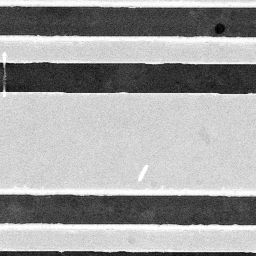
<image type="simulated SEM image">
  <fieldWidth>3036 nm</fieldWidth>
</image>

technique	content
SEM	lines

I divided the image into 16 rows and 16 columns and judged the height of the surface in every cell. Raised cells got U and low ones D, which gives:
DDDDDDDDDDDDDDDD
DDDDDDDDDDDDDDDD
UUUUUUUUUUUUUUUU
UUUUUUUUUUUUUUUU
DDDDDDDDDDDDDDDD
DDDDDDDDDDDDDDDD
UUUUUUUUUUUUUUUU
UUUUUUUUUUUUUUUU
UUUUUUUUUUUUUUUU
UUUUUUUUUUUUUUUU
UUUUUUUUUUUUUUUU
UUUUUUUUUUUUUUUU
DDDDDDDDDDDDDDDD
DDDDDDDDDDDDDDDD
UUUUUUUUUUUUUUUU
UUUUUUUUUUUUUUUU